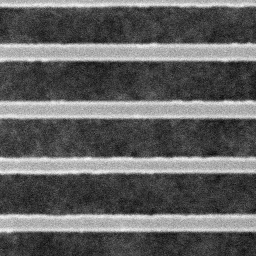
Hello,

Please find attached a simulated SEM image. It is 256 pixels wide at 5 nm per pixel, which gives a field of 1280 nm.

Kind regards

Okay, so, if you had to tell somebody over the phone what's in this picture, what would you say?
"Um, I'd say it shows lines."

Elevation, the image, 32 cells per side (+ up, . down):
++++++++++++++++++++++++++++++++
................................
................................
................................
................................
...................+......+..+.+
++++++++++++++++++++++++++++++++
++++++++++++++++++++++++++++++++
................................
................................
................................
................................
................................
++++++++++++++++++++++++++++++++
++++++++++++++++++++++++++++++++
................................
................................
................................
................................
................................
++++++++++++++++++++++++++++++++
++++++++++++++++++++++++++++++++
................................
................................
................................
................................
................................
++++++++++++++++++++++++++++++++
++++++++++++++++++++++++++++++++
................................
................................
................................